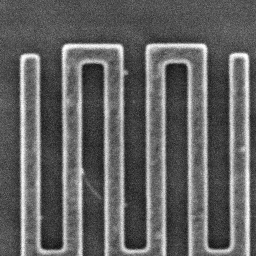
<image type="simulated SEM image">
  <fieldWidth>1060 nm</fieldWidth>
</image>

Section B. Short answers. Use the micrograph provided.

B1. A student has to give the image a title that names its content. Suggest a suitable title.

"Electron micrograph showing groups of lines, slits or small figures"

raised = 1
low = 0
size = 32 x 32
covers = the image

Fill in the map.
00000000000000000000000000000000
00000000000000000000000000000000
00000000000000000000000000000000
00000000000000000000000000000000
00000000000000000000000000000000
00000000000000000000000000000000
00000000111111100011111111000000
00011000111111100011111111000110
00011000110001100011100011000110
00011000110001100011000011000110
00011000110001100001000011000110
00011000110001100001000011000110
00011000110001100001000011000110
00011000110001100001000011000110
00011000110001100001000011000110
00011000110001100001000011000110
00011000110001100001000011000110
00011000110001100001000011000110
00011000110001100001000011000110
00011000110001100001000011000110
00011000110001100001100011000110
00011000110001100001100011000110
00011000110001100001100011000110
00011000110001100001100011000110
00011000110001100001100011000110
00011000110001100001100011000110
00011000110001100001100011000110
00011000110001100001100011000110
00011000110001100001100011000110
00011000110001100001100011000110
00011000110001100001100011000110
00011101110001111111100011111110